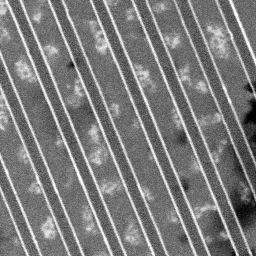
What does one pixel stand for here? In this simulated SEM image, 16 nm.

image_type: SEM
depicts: parallel lines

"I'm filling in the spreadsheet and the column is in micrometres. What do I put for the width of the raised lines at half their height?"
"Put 0.211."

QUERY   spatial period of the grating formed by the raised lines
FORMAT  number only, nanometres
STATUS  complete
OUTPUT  620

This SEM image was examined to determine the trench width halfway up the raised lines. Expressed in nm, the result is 408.